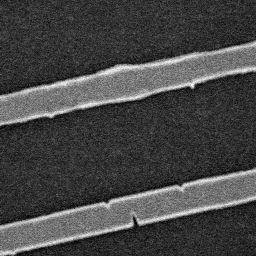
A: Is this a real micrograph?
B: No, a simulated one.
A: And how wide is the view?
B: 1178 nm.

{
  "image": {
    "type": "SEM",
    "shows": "one or a few lines or trenches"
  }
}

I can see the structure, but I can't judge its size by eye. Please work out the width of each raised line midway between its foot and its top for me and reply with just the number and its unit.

124 nanometers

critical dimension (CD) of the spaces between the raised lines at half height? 458 nm